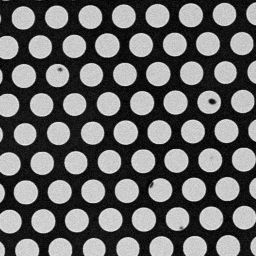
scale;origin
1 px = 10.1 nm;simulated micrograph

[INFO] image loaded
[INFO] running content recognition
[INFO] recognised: an array of small figures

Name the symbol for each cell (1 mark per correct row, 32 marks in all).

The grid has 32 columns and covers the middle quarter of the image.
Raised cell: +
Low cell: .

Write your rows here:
.....++++....++++....+++++....++
+...+++++....+++++...+++++...+++
+...++++++..++++++...+++++...+++
+...++++++...+++++...+++++...+++
+....++++....++++....+++++....++
......++........................
................................
..++......+++.....+++.....++++..
+++++....+++++...+++++...++++++.
+++++...++++++...+++++...++++++.
+++++...++++++...+++++...++++++.
+++++....+++++...+++++....++++..
.+++......+++.....+++......++...
................................
......++......+++.....+++......+
+....++++....+++++...+++++....++
+...++++++...+++++...++++++..+++
+...++++++..++++++...++++++..+++
+....+++++...+++++...+++++....++
.....++++.....+++.....++++.....+
................................
....................+......++...
.++++....+++++....++++....+++++.
++++++...+++++...++++++..++++++.
++++++...+++++...++++++..++++++.
++++++...+++++...++++++...+++++.
.++++....++++.....++++....++++..
................................
................................
.....++++.....++++....++++....++
+....+++++...+++++...++++++...++
++..++++++...++++++..++++++...++